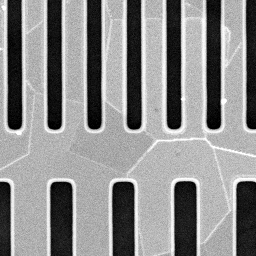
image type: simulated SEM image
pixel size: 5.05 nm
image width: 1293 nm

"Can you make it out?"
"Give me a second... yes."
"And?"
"groups of lines, slits or small figures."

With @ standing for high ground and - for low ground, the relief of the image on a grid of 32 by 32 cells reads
@--@@@--@@@--@@@--@@@--@@@--@@@-
@--@@@--@@@--@@@--@@@--@@@--@@@-
@--@@@--@@@--@@@--@@@--@@@--@@@-
@--@@@--@@@--@@@--@@@--@@@--@@@-
@--@@@--@@@--@@@--@@@--@@@--@@@-
@--@@@--@@@--@@@--@@@--@@@--@@@-
@--@@@--@@@--@@@--@@@--@@@--@@@-
@--@@@--@@@--@@@--@@@--@@@--@@@-
@--@@@--@@@--@@@--@@@--@@@--@@@-
@--@@@--@@@--@@@--@@@--@@@--@@@-
@--@@@--@@@--@@@--@@@--@@@--@@@-
@--@@@--@@@--@@@--@@@--@@@--@@@-
@--@@@--@@@--@@@--@@@--@@@--@@@-
@--@@@--@@@--@@@--@@@--@@@--@@@-
@--@@@--@@@--@@@--@@@--@@@--@@@-
@--@@@--@@@--@@@--@@@--@@@--@@@-
@@@@@@@@@@@@@@@@@@@@@@@@@@@@@@@@
@@@@@@@@@@@@@@@@@@@@@@@@@@@@@@@@
@@@@@@@@@@@@@@@@@@@@@@@@@@@@@@@@
@@@@@@@@@@@@@@@@@@@@@@@@@@@@@@@@
@@@@@@@@@@@@@@@@@@@@@@@@@@@@@@@@
@@@@@@@@@@@@@@@@@@@@@@@@@@@@@@@@
@@@@@@@-@@@@@@@-@@@@@@@-@@@@@@--
-@@@@@---@@@@@---@@@@@---@@@@---
--@@@@---@@@@@---@@@@@---@@@@---
--@@@@---@@@@@---@@@@@---@@@@---
--@@@@---@@@@@---@@@@@---@@@@---
--@@@@---@@@@@---@@@@@---@@@@---
--@@@@---@@@@@---@@@@@---@@@@---
--@@@@---@@@@@---@@@@@---@@@@---
--@@@@---@@@@@---@@@@@---@@@@---
--@@@@---@@@@@---@@@@@---@@@@---